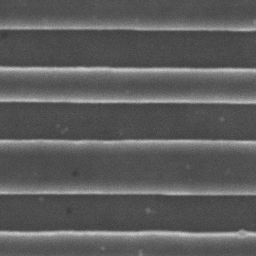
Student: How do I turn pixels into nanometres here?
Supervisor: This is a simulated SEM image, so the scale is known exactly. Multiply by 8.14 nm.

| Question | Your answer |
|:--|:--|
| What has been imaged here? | lines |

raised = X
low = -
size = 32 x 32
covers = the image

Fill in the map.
XXXXXXXXXXXXXXXXXXXXXXXXXXXXXXXX
XXXXXXXXXXXXXXXXXXXXXXXXXXXXXXXX
XXXXXXXXXXXXXXXXXXXXXXXXXXXXXXXX
XXXXXXXXXXXXXXXXXXXXXXXXXXXXXXXX
--------------------------------
--------------------------------
--------------------------------
--------------------------------
------X-------------------------
XXXXXXXXXXXXXXXXXXXXXXXXXXXXXXXX
XXXXXXXXXXXXXXXXXXXXXXXXXXXXXXXX
XXXXXXXXXXXXXXXXXXXXXXXXXXXXXXXX
XXXXXXXXXXXXXXXXXXXXXXXXXXXXXXXX
--------------------------------
--------------------------------
--------------------------------
--------------------------------
--------------------------------
XXXXXXXXXXXXXXXXXXXXXXXXXXXXXXXX
XXXXXXXXXXXXXXXXXXXXXXXXXXXXXXXX
XXXXXXXXXXXXXXXXXXXXXXXXXXXXXXXX
XXXXXXXXXXXXXXXXXXXXXXXXXXXXXXXX
XXXXXXXXXXXXXXXXXXXXXXXXXXXXXXXX
XXXXXXXXXXXXXXXXXXXXXXXXXXXXXXXX
--------------------------------
--------------------------------
--------------------------------
--------------------------------
--------------------------------
XXXXXXXXXXXXXXXXXXXXXXXXXXXXXXXX
XXXXXXXXXXXXXXXXXXXXXXXXXXXXXXXX
XXXXXXXXXXXXXXXXXXXXXXXXXXXXXXXX